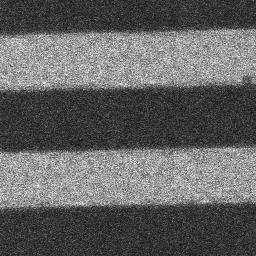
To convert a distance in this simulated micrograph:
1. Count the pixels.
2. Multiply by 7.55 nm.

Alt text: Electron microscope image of one or a few lines or trenches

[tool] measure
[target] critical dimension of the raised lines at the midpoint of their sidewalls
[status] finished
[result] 0.494 micrometres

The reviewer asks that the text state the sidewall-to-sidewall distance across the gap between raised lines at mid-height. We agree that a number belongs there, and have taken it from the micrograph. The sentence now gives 392 nm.